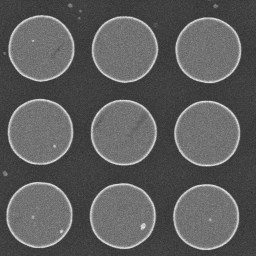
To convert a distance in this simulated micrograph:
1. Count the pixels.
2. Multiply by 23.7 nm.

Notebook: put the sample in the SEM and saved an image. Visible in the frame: an array of small figures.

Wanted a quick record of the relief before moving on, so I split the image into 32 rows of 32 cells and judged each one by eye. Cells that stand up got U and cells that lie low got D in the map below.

DDDDDDDDDDDDDDDDDDDDDDDDDDDDDDDD
DDDDDDDDDDDDDDDDDDDDDDDDDDDDDDDD
DDDUUUUDDDDDDDUUUDDDDDDDDUUUDDDD
DDUUUUUUDDDDUUUUUUUDDDDUUUUUUDDD
DUUUUUUUUDDDUUUUUUUDDDUUUUUUUUDD
DUUUUUUUUDDDUUUUUUUUDDUUUUUUUUDD
DUUUUUUUUDDDUUUUUUUUDDUUUUUUUUDD
DUUUUUUUUDDDUUUUUUUDDDUUUUUUUUDD
DDUUUUUUDDDDUUUUUUUDDDDUUUUUUDDD
DDDUUUUDDDDDDUUUUUDDDDDUUUUUUDDD
DDDDDDDDDDDDDDDDDDDDDDDDDDDDDDDD
DDDDDDDDDDDDDDDDDDDDDDDDDDDDDDDD
DDDDUUDDDDDDDDDDDDDDDDDDDDDDDDDD
DDUUUUUUDDDDDUUUUUDDDDDUUUUUDDDD
DUUUUUUUUDDDUUUUUUUDDDUUUUUUUDDD
DUUUUUUUUDDDUUUUUUUDDDUUUUUUUUDD
DUUUUUUUUDDUUUUUUUUUDDUUUUUUUUDD
DUUUUUUUUDDUUUUUUUUDDDUUUUUUUUDD
DUUUUUUUUDDDUUUUUUUDDDUUUUUUUUDD
DDUUUUUUDDDDDUUUUUDDDDDUUUUUUDDD
DDDDUUDDDDDDDDUUUDDDDDDDUUUDDDDD
DDDDDDDDDDDDDDDDDDDDDDDDDDDDDDDD
DDDDDDDDDDDDDDDDDDDDDDDDDDDDDDDD
DDDUUUUDDDDDDUUUUDDDDDDDUUUUDDDD
DDUUUUUUDDDDUUUUUUUDDDDUUUUUUDDD
DUUUUUUUUDDDUUUUUUUDDDUUUUUUUUDD
DUUUUUUUUDDUUUUUUUUDDDUUUUUUUUDD
DUUUUUUUUDDUUUUUUUUDDDUUUUUUUUDD
DUUUUUUUUDDDUUUUUUUDDDUUUUUUUUDD
DDUUUUUUDDDDUUUUUUUDDDUUUUUUUDDD
DDDUUUUDDDDDDUUUUDDDDDDUUUUUDDDD
DDDDDDDDDDDDDDDDDDDDDDDDDDDDDDDD